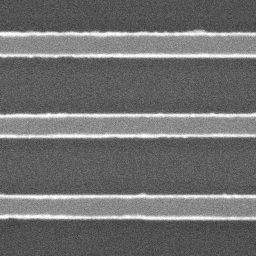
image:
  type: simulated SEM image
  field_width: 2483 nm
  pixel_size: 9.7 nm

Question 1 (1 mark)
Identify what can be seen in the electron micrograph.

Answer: lines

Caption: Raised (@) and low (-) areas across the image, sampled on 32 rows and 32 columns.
--------------------------------
--------------------------------
--------------------------------
--------------------------------
@@@@@@@@@@@@@@@@@@@@@@@@@@@@@@@@
@@@@@@@@@@@@@@@@@@@@@@@@@@@@@@@@
@@@@@@@@@@@@@@@@@@@@@@@@@@@@@@@@
--------------------------------
--------------------------------
--------------------------------
--------------------------------
--------------------------------
--------------------------------
--------------------------------
@@@@@@@@@@@@@@@@@@@@@@@@@@@@@@@@
@@@@@@@@@@@@@@@@@@@@@@@@@@@@@@@@
@@@@@@@@@@@@@@@@@@@@@@@@@@@@@@@@
--------------------------------
--------------------------------
--------------------------------
--------------------------------
--------------------------------
--------------------------------
--------------------------------
@@@@@@@@@@@@@@@@@@@@@@@@@@@@@@@@
@@@@@@@@@@@@@@@@@@@@@@@@@@@@@@@@
@@@@@@@@@@@@@@@@@@@@@@@@@@@@@@@@
--------------------------------
--------------------------------
--------------------------------
--------------------------------
--------------------------------